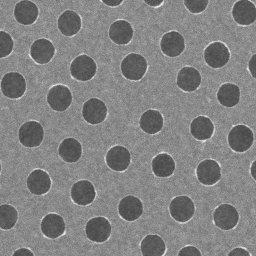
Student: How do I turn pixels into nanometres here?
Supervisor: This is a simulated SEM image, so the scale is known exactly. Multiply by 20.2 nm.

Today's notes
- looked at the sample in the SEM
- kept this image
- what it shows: a regular array of holes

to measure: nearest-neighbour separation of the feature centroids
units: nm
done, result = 811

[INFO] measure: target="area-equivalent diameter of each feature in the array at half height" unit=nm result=509